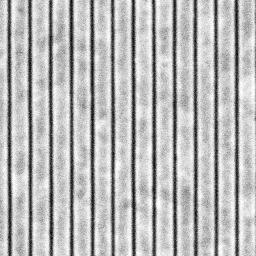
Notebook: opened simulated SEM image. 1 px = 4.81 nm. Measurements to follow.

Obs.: parallel lines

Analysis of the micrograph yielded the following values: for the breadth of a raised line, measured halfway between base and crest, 76.4 nanometres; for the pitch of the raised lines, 0.0994 µm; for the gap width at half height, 22.9 nm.